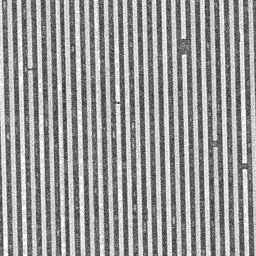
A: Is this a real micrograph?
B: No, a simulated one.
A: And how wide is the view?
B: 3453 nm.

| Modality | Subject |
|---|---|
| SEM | parallel lines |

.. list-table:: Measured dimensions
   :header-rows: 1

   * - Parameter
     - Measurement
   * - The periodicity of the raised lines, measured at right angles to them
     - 130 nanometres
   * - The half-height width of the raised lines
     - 45.5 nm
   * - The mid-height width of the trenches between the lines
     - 79.2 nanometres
